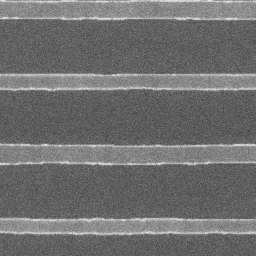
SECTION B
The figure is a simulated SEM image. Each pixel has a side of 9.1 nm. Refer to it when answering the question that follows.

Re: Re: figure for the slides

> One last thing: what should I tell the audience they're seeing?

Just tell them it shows lines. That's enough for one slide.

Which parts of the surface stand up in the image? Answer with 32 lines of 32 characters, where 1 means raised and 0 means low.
11111111111111111111111111111111
11111111111111111111111111111111
00000000000000000000000000000000
00000000000000000000000000000000
00000000000000000000000000000000
00000000000000000000000000000000
00000000000000000000000000000000
00000000000000000000000000000000
00000000000000000000000000000000
11111111111111111111111111111111
11111111111111111111111111111111
00000000000000000000000000000000
00000000000000000000000000000000
00000000000000000000000000000000
00000000000000000000000000000000
00000000000000000000000000000000
00000000000000000000000000000000
00000000000000000000000000000000
11111111111111111111111111111111
11111111111111111111111111111111
01100000000001111110000010000000
00000000000000000000000000000000
00000000000000000000000000000000
00000000000000000000000000000000
00000000000000000000000000000000
00000000000000000000000000000000
00000000000000000000000000000000
11111000111111111111111111111111
11111111111111111111111111111111
00000000000000000000000000000000
00000000000000000000000000000000
00000000000000000000000000000000